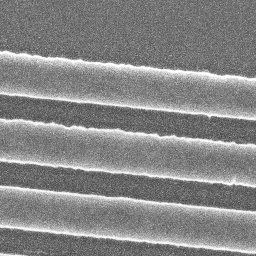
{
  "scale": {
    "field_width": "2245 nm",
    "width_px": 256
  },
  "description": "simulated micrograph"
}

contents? one or a few lines or trenches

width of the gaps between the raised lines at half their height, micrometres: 0.226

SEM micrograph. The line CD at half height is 40.3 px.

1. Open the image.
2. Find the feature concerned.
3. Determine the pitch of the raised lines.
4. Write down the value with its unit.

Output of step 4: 582 nanometres